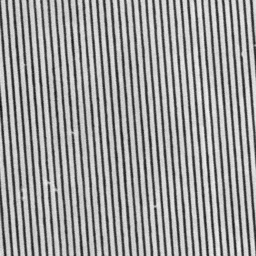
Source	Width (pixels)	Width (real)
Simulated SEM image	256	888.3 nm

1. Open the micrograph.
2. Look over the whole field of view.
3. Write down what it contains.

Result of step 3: parallel lines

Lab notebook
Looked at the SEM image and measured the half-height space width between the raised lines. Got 12.1 nm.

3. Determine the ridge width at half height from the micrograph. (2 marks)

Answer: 12.1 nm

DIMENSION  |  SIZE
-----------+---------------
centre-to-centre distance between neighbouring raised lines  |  24.2 nanometers